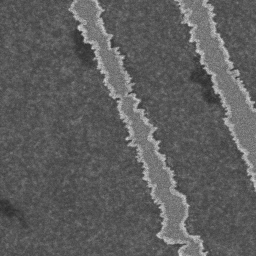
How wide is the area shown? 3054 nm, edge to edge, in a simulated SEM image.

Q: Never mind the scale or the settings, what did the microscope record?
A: one or a few lines or trenches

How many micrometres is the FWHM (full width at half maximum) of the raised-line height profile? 0.254